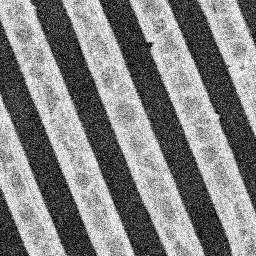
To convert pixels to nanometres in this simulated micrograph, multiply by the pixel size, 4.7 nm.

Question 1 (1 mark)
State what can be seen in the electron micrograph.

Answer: one or a few lines or trenches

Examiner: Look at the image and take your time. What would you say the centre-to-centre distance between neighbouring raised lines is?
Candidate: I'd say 299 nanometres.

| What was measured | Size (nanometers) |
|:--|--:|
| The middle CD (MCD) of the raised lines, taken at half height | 128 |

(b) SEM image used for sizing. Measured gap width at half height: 0.169 microns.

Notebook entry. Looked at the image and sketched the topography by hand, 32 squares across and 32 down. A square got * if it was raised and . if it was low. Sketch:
***.....****.....****.....***...
****.....***.....****.....****..
.***.....****.....***.....****..
.****.....***.....****.....***..
.****.....****.....***.....****.
..***.....****......***.....***.
..****.....****....****.....***.
...***.....****.....****.....***
...****.....***.....****.....***
...****.....****.....***.....***
....****....****.....****.....**
....****.....***......***.....**
.....***.....****.....****.....*
.....****.....***.....****.....*
*.....***.....****.....****....*
*.....****....****.....****.....
*.....****.....***......***.....
**.....***.....****.....****....
**.....****.....***.....****....
***.....***.....****.....****...
***.....****.....***.....****...
***.....****.....****.....***...
****.....***.....****.....****..
.***.....****.....***.....****..
.****.....***.....****.....***..
.****.....****.....***.....****.
..***.....****.....****.....***.
..****.....***......***.....****
...***.....****.....****....****
...****.....***.....****.....***
....***.....****.....***.....***
....****.....***.....****....***